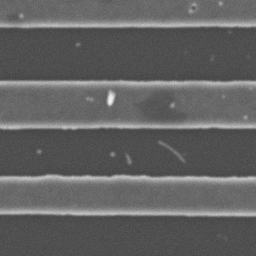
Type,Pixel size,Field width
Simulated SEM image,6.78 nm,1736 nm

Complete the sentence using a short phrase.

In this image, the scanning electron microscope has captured lines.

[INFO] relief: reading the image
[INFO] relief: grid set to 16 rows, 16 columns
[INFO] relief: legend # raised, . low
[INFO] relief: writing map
################
################
................
................
................
################
################
################
................
................
................
################
################
................
................
................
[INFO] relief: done